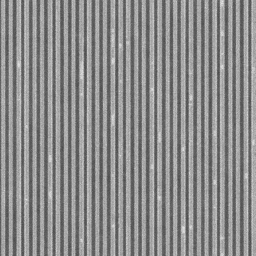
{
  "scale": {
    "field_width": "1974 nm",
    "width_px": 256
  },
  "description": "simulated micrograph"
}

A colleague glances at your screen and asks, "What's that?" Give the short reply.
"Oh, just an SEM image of parallel lines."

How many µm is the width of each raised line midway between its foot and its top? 0.027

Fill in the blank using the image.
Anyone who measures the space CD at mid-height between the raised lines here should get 32.8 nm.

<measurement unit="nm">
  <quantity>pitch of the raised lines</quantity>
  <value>60.4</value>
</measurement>